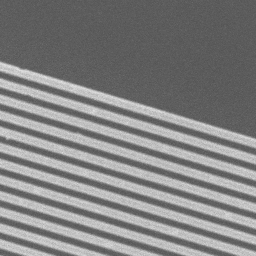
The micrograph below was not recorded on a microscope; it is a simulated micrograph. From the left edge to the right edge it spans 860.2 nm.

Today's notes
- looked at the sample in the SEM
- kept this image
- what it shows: parallel lines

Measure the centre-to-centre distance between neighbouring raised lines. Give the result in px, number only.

15.4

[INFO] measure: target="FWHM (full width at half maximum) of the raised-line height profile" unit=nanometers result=26.2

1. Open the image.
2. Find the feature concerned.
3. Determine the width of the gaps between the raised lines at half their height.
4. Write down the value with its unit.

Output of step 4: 26.2 nanometers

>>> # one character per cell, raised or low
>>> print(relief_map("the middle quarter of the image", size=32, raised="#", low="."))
................................
................................
................................
................................
................................
####............................
#######.........................
....######......................
.......#######..................
###.......#######...............
#######.......######............
...#######.......#######........
......#######.......#######.....
###......########.......######..
#######......#######.......#####
...#######......#######.......##
.......######......########.....
####......#######......#######..
######.......#######......######
...#######......#######......###
......#######.......######......
###.......######.......#######..
######.......#######......######
...######.......#######.......##
......#######.......######......
###......#######.......#######..
######.......######.......######
...#######......#######.......##
......#######......#######......
###......########......######...
######.......######.......######
..########......#######......###